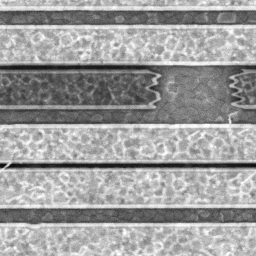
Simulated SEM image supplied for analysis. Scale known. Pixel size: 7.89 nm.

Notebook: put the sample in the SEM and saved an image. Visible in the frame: parallel lines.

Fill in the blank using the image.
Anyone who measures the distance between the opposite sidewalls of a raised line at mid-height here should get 298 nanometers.